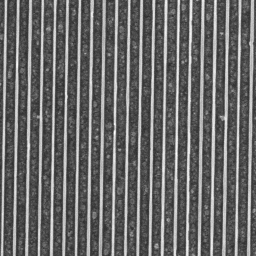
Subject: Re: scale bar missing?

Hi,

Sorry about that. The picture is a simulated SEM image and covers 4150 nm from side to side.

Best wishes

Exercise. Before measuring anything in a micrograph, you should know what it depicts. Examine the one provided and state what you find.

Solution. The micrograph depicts parallel lines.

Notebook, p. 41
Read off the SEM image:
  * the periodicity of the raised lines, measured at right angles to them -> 200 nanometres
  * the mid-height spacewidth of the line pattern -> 0.162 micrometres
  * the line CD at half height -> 0.0304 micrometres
